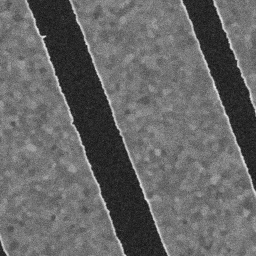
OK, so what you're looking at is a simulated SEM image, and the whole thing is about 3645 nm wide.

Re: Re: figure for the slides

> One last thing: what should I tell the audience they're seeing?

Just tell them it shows one or a few lines or trenches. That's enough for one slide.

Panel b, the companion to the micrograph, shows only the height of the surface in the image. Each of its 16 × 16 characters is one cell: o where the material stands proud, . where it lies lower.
oo...ooooooo..oo
oo...ooooooo..oo
ooo..ooooooo..oo
ooo...ooooooo..o
ooo...ooooooo..o
oooo..oooooooo.o
oooo...ooooooo..
ooooo..ooooooo..
ooooo...ooooooo.
ooooo...ooooooo.
oooooo..ooooooo.
oooooo...ooooooo
oooooo...ooooooo
ooooooo...oooooo
ooooooo...oooooo
oooooooo..oooooo